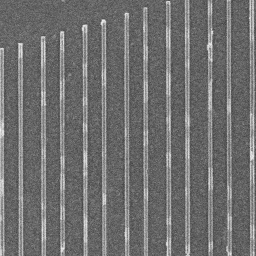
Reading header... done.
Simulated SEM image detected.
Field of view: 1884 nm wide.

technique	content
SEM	parallel lines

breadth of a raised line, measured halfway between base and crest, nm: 26.7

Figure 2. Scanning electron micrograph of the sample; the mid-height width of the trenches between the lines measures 138 nm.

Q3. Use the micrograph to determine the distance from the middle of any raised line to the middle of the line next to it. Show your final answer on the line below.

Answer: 154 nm